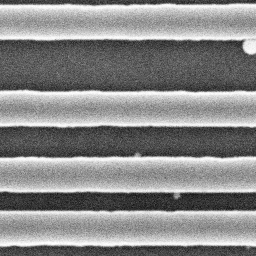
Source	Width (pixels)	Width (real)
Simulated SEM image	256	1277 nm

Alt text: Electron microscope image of lines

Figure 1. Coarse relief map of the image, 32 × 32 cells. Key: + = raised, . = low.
................................
++++++++++++++++++++++++++++++++
++++++++++++++++++++++++++++++++
++++++++++++++++++++++++++++++++
++++++++++++++++++++++++++++++++
...............................+
...............................+
................................
................................
................................
................................
.++++......+....................
++++++++++++++++++++++++++++++++
++++++++++++++++++++++++++++++++
++++++++++++++++++++++++++++++++
++++++++++++++++++++++++++++++++
................................
................................
................................
................................
++++++++++++++++++++++++++++++++
++++++++++++++++++++++++++++++++
++++++++++++++++++++++++++++++++
++++++++++++++++++++++++++++++++
................................
................................
+++++.+++.+++.++.+++..++.++++++.
++++++++++++++++++++++++++++++++
++++++++++++++++++++++++++++++++
++++++++++++++++++++++++++++++++
+++++...+++++++++++++++++.++++++
................................